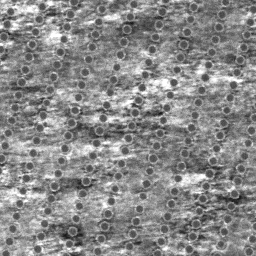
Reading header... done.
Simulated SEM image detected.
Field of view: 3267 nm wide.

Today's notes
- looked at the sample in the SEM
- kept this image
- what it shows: a regular array of raised bodies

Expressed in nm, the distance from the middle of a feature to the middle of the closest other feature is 164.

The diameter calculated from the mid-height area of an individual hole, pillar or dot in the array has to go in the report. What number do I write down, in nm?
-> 109